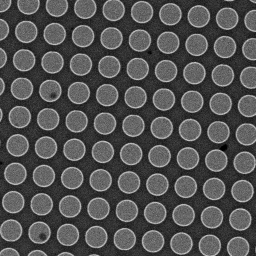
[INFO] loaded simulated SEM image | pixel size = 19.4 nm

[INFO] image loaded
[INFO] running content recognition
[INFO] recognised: an array of small figures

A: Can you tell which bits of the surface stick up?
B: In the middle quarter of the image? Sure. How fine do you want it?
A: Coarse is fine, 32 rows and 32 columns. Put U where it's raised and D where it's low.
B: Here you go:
DDUUUUUDDUUUUUDDUUUUUDDUUUUUDDDU
DDUUUUUDDUUUUUDDUUUUUDDUUUUUDDUU
DDDUUUDDDUUUUDDDUUUUUDDUUUUUDDUU
DDDDDDDDDDDDDDDDDUUUDDDDUUUUDDUU
DDDDDDDDDDDDDDDDDDDDDDDDDDDDDDDU
DDUUUUDDDUUUDDDDDDDDDDDDDDDDDDDD
DUUUUUDDUUUUUDDDUUUUDDDDUUDDDDDD
DUUUUUDDUUUUUDDUUUUUDDDUUUUDDDUU
DUUUUUDDUUUUUDDUUUUUUDUUUUUUDUUU
DDUUUDDDDUUUUDDUUUUUDDUUUUUUDUUU
DDDDDDDDDDDDDDDDUUUDDDDUUUUDDDUU
DDDDDDDDDDDDDDDDDDDDDDDDUUDDDDUU
DUUUUDDDDUUUDDDDDDDDDDDDDDDDDDDD
DUUUUUDDUUUUUDDUUUUDDDDUUUDDDDDD
DUUUUUDDUUUUUDDUUUUUDDUUUUUDDDUU
DUUUUUDDUUUUUDDUUUUUDDUUUUUDDUUU
DDUUUDDDUUUUDDDUUUUUDDUUUUUDDUUU
DDDDDDDDDUUDDDDDUUUDDDUUUUUDDUUU
DDDDDDDDDDDDDDDDDDDDDDDUUDDDDDUU
DUUUUDDDDUUDDDDDDDDDDDDDDDDDDDDD
UUUUUDDUUUUUDDDUUUUDDDDUUDDDDDDD
UUUUUDDUUUUUDDUUUUUDDDUUUUDDDUUU
UUUUUDDUUUUUDDUUUUUDDUUUUUDDDUUU
DUUUDDDUUUUUDDUUUUUDDUUUUUUDUUUU
DDDDDDDDDUUDDDDUUUUDDUUUUUDDUUUU
DDDDDDDDDDDDDDDDDDDDDDDUUDDDDUUU
UUUUDDDDDUDDDDDDDDDDDDDDDDDDDDDD
UUUUUDDUUUUDDDDUUUDDDDDUDDDDDDDD
UUUUUDDUUUUUDDUUUUUDDUUUUUDDDUUU
UUUUUDDUUUUUDDUUUUUDDUUUUUDDUUUU
UUUUDDDUUUUUDDUUUUUDDUUUUUDDUUUU
DDDDDDDDUUDDDDUUUUDDDUUUUUDDUUUU